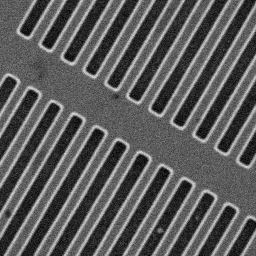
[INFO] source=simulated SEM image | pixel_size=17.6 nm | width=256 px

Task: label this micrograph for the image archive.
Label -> groups of lines, slits or small figures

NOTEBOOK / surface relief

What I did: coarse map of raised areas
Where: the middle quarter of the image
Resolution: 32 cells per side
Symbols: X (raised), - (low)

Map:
XXXXX----XXXX----XXX----XXXX---X
XXXXX----XXX----XXXX----XXX----X
XXXXXX--XXXX----XXX----XXX----XX
XXXXXXXXXXX----XXX-----XXX----XX
XXXXXXXXXXX----XXX----XXX----XXX
XXXXXXXXXXX---XXX----XXXX----XXX
XXXXXXXXXXXXXXXXX----XXX----XXX-
XXXXXXXXXXXXXXXX----XXX-----XXX-
XXXXXXXXXXXXXXXX----XXX----XXX--
XXXXXXXXXXXXXXXXXX-XXX----XXXX--
XXXXXXXXXXXXXXXXXXXXXX----XXX---
XXXXXXXXXXXXXXXXXXXXXX---XXXX---
XX-XXXXXXXXXXXXXXXXXXXX-XXXX----
XX--XXXXXXXXXXXXXXXXXXXXXXX----X
X----XXXXXXXXXXXXXXXXXXXXXX----X
----XXXXXXXXXXXXXXXXXXXXXXXX--XX
----XXX---XXXXXXXXXXXXXXXXXXXXXX
---XXXX---XXXXXXXXXXXXXXXXXXXXXX
---XXX----XXXXXXXXXXXXXXXXXXXXXX
--XXX----XXXX--XXXXXXXXXXXXXXXXX
-XXXX----XXX----XXXXXXXXXXXXXXXX
-XXX----XXX-----XXXXXXXXXXXXXXXX
XXXX----XXX----XXX--XXXXXXXXXXXX
XXX----XXX----XXXX---XXXXXXXXXXX
XX-----XXX----XXX----XXXXXXXXXXX
XX----XXX----XXX-----XXX-XXXXXXX
X----XXXX----XXX----XXX---XXXXXX
X----XXX----XXX----XXXX----XXXXX
----XXX----XXXX----XXX----XXXXXX
----XXX----XXX----XXXX----XXX---
---XXX----XXXX----XXX----XXX----
--XXXX----XXX----XXX-----XXX----